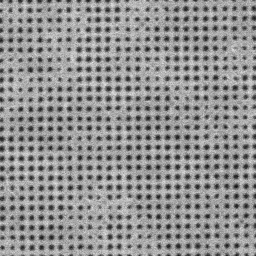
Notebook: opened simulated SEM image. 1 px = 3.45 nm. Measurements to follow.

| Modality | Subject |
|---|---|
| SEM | a regular array of holes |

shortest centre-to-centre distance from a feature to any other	32.8	nanometers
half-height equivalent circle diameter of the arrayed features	18.7	nanometres